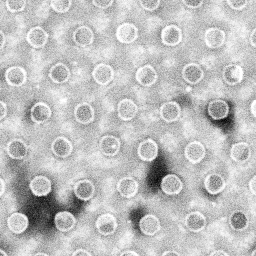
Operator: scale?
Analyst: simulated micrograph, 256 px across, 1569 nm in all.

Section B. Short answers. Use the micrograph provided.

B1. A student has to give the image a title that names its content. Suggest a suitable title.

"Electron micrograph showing a regular array of raised bodies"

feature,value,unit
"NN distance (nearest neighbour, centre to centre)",250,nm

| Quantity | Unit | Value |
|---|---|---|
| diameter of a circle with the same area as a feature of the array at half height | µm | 0.118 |